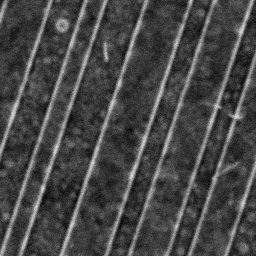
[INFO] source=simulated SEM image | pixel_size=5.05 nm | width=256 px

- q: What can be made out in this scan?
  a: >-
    one or a few lines or trenches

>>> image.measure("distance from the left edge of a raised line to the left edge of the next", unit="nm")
324